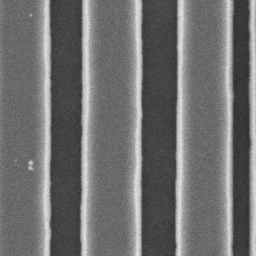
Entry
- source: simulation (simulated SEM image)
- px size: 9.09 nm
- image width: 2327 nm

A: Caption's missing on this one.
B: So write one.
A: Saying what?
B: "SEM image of lines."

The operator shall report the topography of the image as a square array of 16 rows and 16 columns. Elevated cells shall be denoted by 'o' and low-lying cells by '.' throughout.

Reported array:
ooo..oooo..ooo..
ooo..oooo..ooo..
ooo..oooo..ooo..
ooo..oooo..ooo..
ooo..oooo..ooo..
ooo..oooo..ooo..
ooo..oooo..ooo..
ooo..oooo..ooo..
ooo..oooo..ooo..
ooo..oooo..ooo..
ooo..oooo..ooo..
ooo..oooo..ooo..
ooo..oooo..ooo..
ooo..oooo..ooo..
ooo..oooo..ooo..
ooo..oooo..ooo..